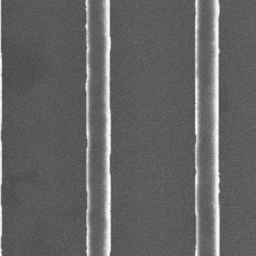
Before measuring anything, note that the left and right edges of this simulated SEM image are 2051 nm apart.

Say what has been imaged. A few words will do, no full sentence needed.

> lines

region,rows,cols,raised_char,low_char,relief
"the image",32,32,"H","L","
LLLLLLLLLLLHHHLLLLLLLLLLHHHLLLLL
LLLLLLLLLLLHHHLLLLLLLLLLHHHLLLLL
LLLLLLLLLLLHHHLLLLLLLLLLHHHLLLLL
LLLLLLLLLLLHHHLLLLLLLLLLHHHLLLLL
LLLLLLLLLLLHHHLLLLLLLLLLHHHLLLLL
LLLLLLLLLLLHHHLLLLLLLLLLHHHLLLLL
LLLLLLLLLLLHHHLLLLLLLLLLHHHLLLLL
LLLLLLLLLLLHHHLLLLLLLLLLHHHLLLLL
LLLLLLLLLLLHHHLLLLLLLLLLHHHLLLLL
LLLLLLLLLLLHHHLLLLLLLLLLHHHLLLLL
LLLLLLLLLLLHHHLLLLLLLLLLHHHLLLLL
LLLLLLLLLLLHHHLLLLLLLLLLHHHLLLLL
LLLLLLLLLLLHHHLLLLLLLLLLHHHLLLLL
LLLLLLLLLLLHHHLLLLLLLLLLHHHLLLLL
LLLLLLLLLLLHHHLLLLLLLLLLHHHLLLLL
LLLLLLLLLLLHHHLLLLLLLLLLHHHLLLLL
LLLLLLLLLLLHHHLLLLLLLLLLHHHLLLLL
LLLLLLLLLLLHHHLLLLLLLLLLHHHLLLLL
LLLLLLLLLLLHHHLLLLLLLLLLHHHLLLLL
LLLLLLLLLLLHHHLLLLLLLLLLHHHLLLLL
LLLLLLLLLLLHHHLLLLLLLLLLHHHLLLLL
LLLLLLLLLLLHHHLLLLLLLLLLHHHLLLLL
LLLLLLLLLLLHHHLLLLLLLLLLHHHLLLLL
LLLLLLLLLLLHHHLLLLLLLLLLHHHLLLLL
LLLLLLLLLLLHHHLLLLLLLLLLHHHLLLLL
LLLLLLLLLLLHHHLLLLLLLLLLHHHLLLLL
LLLLLLLLLLLHHHLLLLLLLLLLHHHLLLLL
LLLLLLLLLLLHHHLLLLLLLLLLLHHLLLLL
LLLLLLLLLLLHHHLLLLLLLLLLLHHLLLLL
LLLLLLLLLLLHHHLLLLLLLLLLLHHLLLLL
LLLLLLLLLLLHHHLLLLLLLLLLHHHLLLLL
LLLLLLLLLLLHHHLLLLLLLLLLHHHLLLLL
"